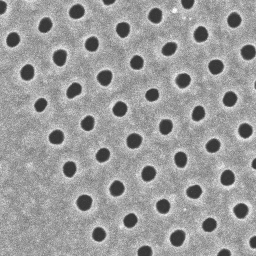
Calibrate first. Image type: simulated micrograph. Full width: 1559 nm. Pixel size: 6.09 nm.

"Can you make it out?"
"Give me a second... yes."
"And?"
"a regular array of holes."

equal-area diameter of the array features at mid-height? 14.6 pixels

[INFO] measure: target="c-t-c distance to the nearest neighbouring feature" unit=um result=0.211